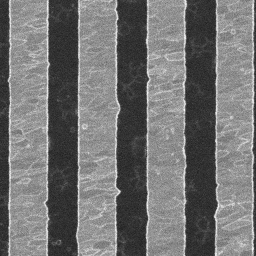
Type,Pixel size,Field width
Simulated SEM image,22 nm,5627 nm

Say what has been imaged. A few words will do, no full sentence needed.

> one or a few lines or trenches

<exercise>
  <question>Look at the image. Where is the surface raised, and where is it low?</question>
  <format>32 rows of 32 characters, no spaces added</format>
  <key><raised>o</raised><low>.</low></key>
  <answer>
.ooooo....ooooo....oooo....ooooo
.ooooo....oooo.....oooo....ooooo
.ooooo....ooooo....oooo....ooooo
.ooooo....ooooo....oooo....ooooo
.ooooo....oooo....ooooo....ooooo
.ooooo....oooo....ooooo....ooooo
.ooooo....oooo.....oooo....ooooo
.ooooo....oooo.....oooo....ooooo
.ooooo....ooooo....oooo....ooooo
.ooooo....ooooo....oooo....ooooo
.ooooo....ooooo....oooo....ooooo
.ooooo....oooo....ooooo....ooooo
.ooooo....ooooo...ooooo....ooooo
.ooooo....ooooo...ooooo....ooooo
.ooooo....ooooo...ooooo....ooooo
.ooooo....ooooo...ooooo....ooooo
.ooooo....ooooo...ooooo....ooooo
.ooooo....oooo....ooooo....ooooo
.ooooo....oooo....ooooo....ooooo
.ooooo....oooo...oooooo....ooooo
.ooooo....oooo....ooooo....ooooo
.ooooo....ooooo...ooooo....ooooo
.ooooo....ooooo...ooooo....ooooo
.ooooo....ooooo...ooooo....ooooo
.ooooo....ooooo....oooo....ooooo
.ooooo....oooo....ooooo....ooooo
.ooooo....oooo....ooooo....ooooo
.ooooo....oooo.....oooo....ooooo
.ooooo....oooo....ooooo....ooooo
.ooooo....oooo....ooooo....ooooo
.ooooo....oooo....ooooo....ooooo
.ooooo....oooo....ooooo....ooooo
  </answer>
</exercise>